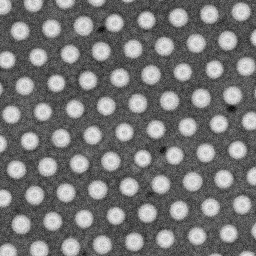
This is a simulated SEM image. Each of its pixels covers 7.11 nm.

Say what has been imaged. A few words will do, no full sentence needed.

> an array of small figures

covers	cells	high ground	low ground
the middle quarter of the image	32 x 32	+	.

.....................+......+++.
.............++.....++++....++++
.....++.....++++....++++....++++
....++++....++++....++++....+++.
....++++....++++....+++.........
....++++.....++.................
................................
.........................+++....
..........+......+++....+++++...
.+++.....+++....+++++...+++++...
.++++...+++++...+++++...++++....
.++++....++++....+++............
.++++....+++....................
................................
......................++.....+++
..............+++....++++....+++
.....++++....++++....++++....+++
+....++++....++++....++++....+++
+....++++....++++.....+.........
+.....+++.......................
................................
..........................+++...
..........+++.....+++.....++++..
..++++....++++....++++....++++..
..++++....++++....++++....+++...
..++++....++++.....++...........
..++++.....+....................
...............................+
.......................+++....++
.......++......+++....++++....++
++....++++....++++....++++....++
+++...+++++...++++....++++.....+